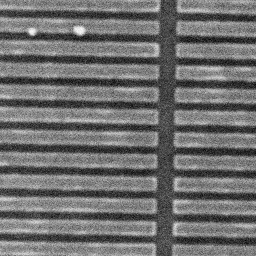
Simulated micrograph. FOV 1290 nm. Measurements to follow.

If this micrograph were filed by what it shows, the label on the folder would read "groups of lines, slits or small figures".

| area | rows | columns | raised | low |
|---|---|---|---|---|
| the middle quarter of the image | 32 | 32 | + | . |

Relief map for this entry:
++++++++++++++++................
++++++++++++++++++++++++....++++
++++++++++++++++++++++++....++++
...................++++.....++++
................................
................................
+++++++++++++++..++++++.....++++
+++++++++++++++++++++++.....++++
+++++++++++++++++++++++.....++++
................................
................................
++++++++........................
+++++++++++++++++++++++.....++++
+++++++++++++++++++++++.....++++
................+++++++.....++++
................................
................................
+++++++++++++++++++++++.....++++
+++++++++++++++++++++++.....++++
+++++++++++++++++++++++.....++++
................................
................................
................................
+++++++++++++++++++++++.....++++
+++++++++++++++++++++++.....++++
+++++++++++++++++++++++.....++++
................................
................................
+++++++++++++++++++.............
+++++++++++++++++++++++.....++++
+++++++++++++++++++++++.....++++
..............................++